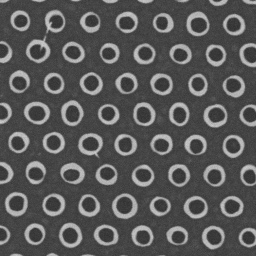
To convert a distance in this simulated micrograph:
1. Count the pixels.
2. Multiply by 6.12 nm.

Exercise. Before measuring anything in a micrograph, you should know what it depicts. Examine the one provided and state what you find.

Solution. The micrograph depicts a regular array of ring-shaped raised bodies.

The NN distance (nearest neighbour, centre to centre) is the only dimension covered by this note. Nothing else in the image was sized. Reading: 207 nm